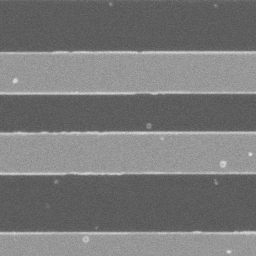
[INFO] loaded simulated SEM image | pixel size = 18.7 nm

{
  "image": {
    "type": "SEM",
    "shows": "lines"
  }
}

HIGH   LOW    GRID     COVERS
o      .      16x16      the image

................
................
................
oooooooooooooooo
oooooooooooooooo
oooooooooooooooo
................
................
oooooooooooooooo
oooooooooooooooo
oooooooooooooooo
................
................
................
................
oooooooooooooooo